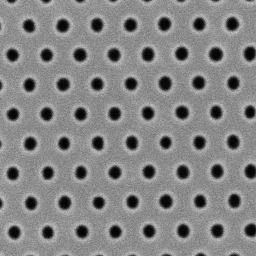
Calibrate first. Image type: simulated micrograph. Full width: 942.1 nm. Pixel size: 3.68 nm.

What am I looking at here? a regular array of holes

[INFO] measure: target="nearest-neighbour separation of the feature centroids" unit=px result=33.4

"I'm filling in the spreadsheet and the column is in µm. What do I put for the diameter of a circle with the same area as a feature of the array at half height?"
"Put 0.0498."